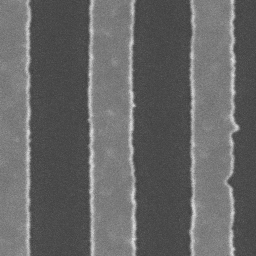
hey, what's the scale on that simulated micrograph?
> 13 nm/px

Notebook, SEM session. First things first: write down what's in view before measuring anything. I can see one or a few lines or trenches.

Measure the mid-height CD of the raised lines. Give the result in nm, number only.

546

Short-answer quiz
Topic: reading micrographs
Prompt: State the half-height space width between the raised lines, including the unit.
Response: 790 nm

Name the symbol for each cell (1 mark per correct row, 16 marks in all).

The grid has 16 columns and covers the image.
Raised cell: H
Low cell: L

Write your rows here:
HHLLLLHHLLLLHHHL
HHLLLLHHLLLLHHHL
HHLLLLHHLLLLHHHL
HHLLLLHHLLLLHHHL
HHLLLLHHLLLLHHHL
HHLLLLHHLLLLHHHL
HHLLLLHHLLLLHHHL
HHLLLLHHLLLLHHHL
HHLLLLHHLLLLHHHL
HHLLLLHHLLLLHHHL
HHLLLLHHLLLLHHLL
HHLLLLHHLLLLHHLL
HHLLLLHHLLLLHHHL
HHLLLLHHLLLLHHHL
HHLLLLHHLLLLHHLL
HHLLLLHHLLLLHHHL